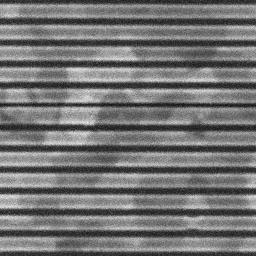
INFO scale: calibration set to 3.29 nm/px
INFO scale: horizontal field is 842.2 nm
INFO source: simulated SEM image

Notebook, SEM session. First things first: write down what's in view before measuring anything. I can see parallel lines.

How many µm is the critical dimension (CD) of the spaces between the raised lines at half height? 0.0288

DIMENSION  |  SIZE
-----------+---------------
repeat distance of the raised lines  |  69.7 nm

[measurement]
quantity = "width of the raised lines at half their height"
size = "40.3 nanometres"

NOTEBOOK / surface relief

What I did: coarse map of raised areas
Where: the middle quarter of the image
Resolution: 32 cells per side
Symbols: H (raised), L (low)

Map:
LLLLLLLLLLLLLLLLLLLLLLLLLLLLLLLL
HHHHHHHHHHHHHHHHHHHHHHHHHHHHHHHH
HHHHHHHHHHHHHHHHHHHHHHHHHHHHHHHH
HHHHHHHHHHHHHHHHHHHHHHHHHHHHHHHH
LLLLLLLLLLLLLLLLLLLLLLLLLLLLLLLL
LLLLLLLLLLLLLLLLLLLLLLLLLLLLLLLL
LLLLLLLLLLLLLLLLLLLLLLLLLLLLLLLL
HHHHHHHHHHHHHHHHHHHHHHHHHHHHHHHH
HHHHHHHHHHHHHHHHHHHHHHHHHHHHHHHH
LLLLLLLLLLLLLLLLLLLLLLLLLLLLLLLL
LLLLLLLLLLLLLLLLLLLLLLLLLLLLLLLL
HHHHHHHHHHHHHHHHHHHHHHHHHHHHHHHH
HHHHHHHHHHHHHHHHHHHHHHHHHHHHHHHH
HHHHHHHHHHHHHHHHHHHHHHHHHHHHHHHH
HHHHHHHHHHHHHHHHHHHHHHHHHHHHHHHH
LLLLLLLLLLLLLLLLLLLLLLLLLLLLLLLL
LLLLLLLLLLLLLLLLLLLLLLLLLLLLLLLL
HHHHHHHHHHHHHHHHHHHHHHHHHHHHHHHH
HHHHHHHHHHHHHHHHHHHHHHHHHHHHHHHH
HHHHHHHHHHHHHHHHHHHHHHHHHHHHHHHH
LLLLLLLLLLLLLLLLLLLLLLLLLLLLLLLL
LLLLLLLLLLLLLLLLLLLLLLLLLLLLLLLL
HHHHHHHHHHHHHHHHHHHHHHHHHHHHHHHH
HHHHHHHHHHHHHHHHHHHHHHHHHHHHHHHH
HHHHHHHHHHHHHHHHHHHHHHHHHHHHHHHH
LLLLLLLLLLLLLLLLLLLLLLLLLLLLLLLL
LLLLLLLLLLLLLLLLLLLLLLLLLLLLLLLL
LLLLLLLLLLLLLLLLLLLLLLLLLLLLLLLL
HHHHHHHHHHHHHHHHHHHHHHHHHHHHHHHH
HHHHHHHHHHHHHHHHHHHHHHHHHHHHHHHH
HHHHHHHHHHHHHHHHHHHHHHHHHLLLLLLL
LLLLLLLLLLLLLLLLLLLLLLLLLLLLLLLL